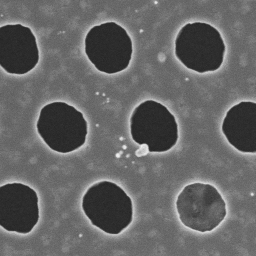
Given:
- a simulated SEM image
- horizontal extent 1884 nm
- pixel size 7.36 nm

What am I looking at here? holes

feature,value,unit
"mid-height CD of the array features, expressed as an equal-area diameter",0.363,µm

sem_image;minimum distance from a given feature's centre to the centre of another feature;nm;670